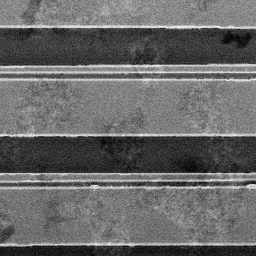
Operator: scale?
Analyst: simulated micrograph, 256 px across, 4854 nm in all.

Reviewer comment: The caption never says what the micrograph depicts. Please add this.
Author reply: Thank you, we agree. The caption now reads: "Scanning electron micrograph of lines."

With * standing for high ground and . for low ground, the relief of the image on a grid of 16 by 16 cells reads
****************
****************
................
................
****************
****************
****************
****************
................
................
................
****************
****************
****************
****************
................